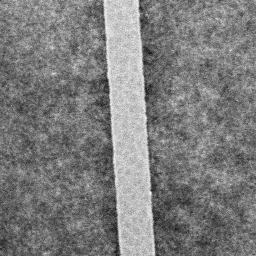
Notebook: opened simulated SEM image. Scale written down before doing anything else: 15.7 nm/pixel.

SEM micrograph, one or a few lines or trenches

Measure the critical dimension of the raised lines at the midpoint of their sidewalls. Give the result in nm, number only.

515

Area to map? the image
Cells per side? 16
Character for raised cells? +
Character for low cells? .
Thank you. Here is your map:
.......++.......
.......++.......
.......++.......
.......++.......
.......++.......
.......++.......
.......++.......
.......++.......
.......++.......
.......++.......
.......++.......
.......++.......
.......++.......
.......++.......
.......+++......
........++......